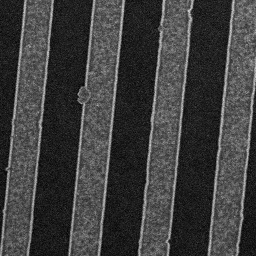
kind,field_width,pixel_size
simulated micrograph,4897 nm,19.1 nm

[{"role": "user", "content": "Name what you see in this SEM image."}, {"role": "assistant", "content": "one or a few lines or trenches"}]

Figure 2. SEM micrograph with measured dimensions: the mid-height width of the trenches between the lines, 786 nm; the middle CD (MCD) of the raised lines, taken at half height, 28 pixels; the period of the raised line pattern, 1320 nm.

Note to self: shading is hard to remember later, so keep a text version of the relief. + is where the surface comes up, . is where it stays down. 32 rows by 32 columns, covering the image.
...+++......+++.....++++.....+++
...+++......+++.....++++.....+++
...+++......+++.....++++.....+++
...+++.....++++.....++++.....+++
...+++.....++++.....++++.....+++
...+++.....++++.....++++.....+++
...+++.....++++.....+++......+++
...+++.....++++.....+++......+++
..++++.....++++.....+++.....++++
..++++.....+++......+++.....++++
..++++.....+++......+++.....++++
..+++.....++++.....++++.....++++
..+++.....++++.....++++.....++++
..+++.....++++.....++++.....+++.
..+++.....++++.....++++.....+++.
..+++.....++++.....++++.....+++.
..+++.....++++.....+++......+++.
..+++.....++++.....+++......+++.
.++++.....++++.....+++.....++++.
.++++.....++++.....+++.....++++.
.++++.....+++......+++.....++++.
.++++.....+++......+++.....++++.
.+++......+++.....++++.....++++.
.+++......+++.....++++.....+++..
.+++.....++++.....++++.....+++..
.+++.....++++.....++++.....+++..
.+++.....++++.....+++......+++..
.+++.....++++.....+++......+++..
++++.....++++.....+++.....++++..
++++.....++++.....+++.....++++..
++++.....+++......+++.....++++..
+++......+++.....++++.....++++..